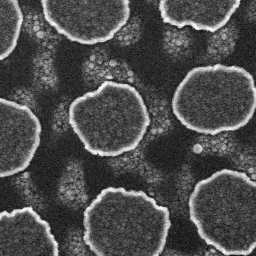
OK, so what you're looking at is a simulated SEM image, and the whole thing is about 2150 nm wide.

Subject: raised bodies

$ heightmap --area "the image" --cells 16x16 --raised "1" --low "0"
1001111100111110
1001111100011100
1000010000000000
0000000000000000
0000000000001110
0000001100011111
1000011110011111
1100111110011110
1100011110000000
1100001000000000
1000000000000000
0000000000000111
0000001110001111
1100011111001111
1110011111000111
1110001111000011